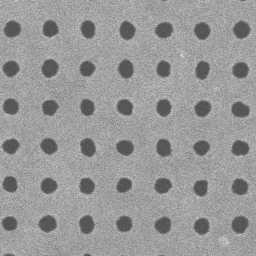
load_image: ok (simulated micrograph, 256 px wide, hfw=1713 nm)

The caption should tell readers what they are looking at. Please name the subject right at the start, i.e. a regular array of holes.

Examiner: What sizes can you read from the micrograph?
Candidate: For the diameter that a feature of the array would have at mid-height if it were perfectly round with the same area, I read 112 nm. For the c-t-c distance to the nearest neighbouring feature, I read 253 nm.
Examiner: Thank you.